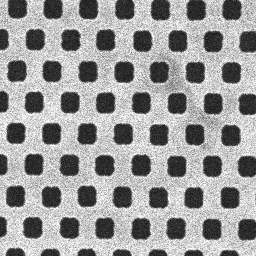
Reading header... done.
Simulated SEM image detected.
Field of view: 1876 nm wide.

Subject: a regular array of holes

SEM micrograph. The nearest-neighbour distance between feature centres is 0.26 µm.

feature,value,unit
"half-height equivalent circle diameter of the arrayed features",0.157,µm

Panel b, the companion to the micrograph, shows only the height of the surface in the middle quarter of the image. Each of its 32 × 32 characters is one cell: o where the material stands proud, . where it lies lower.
oooo....ooooo....ooooo....ooooo.
oooo....ooooo.....ooo.....ooooo.
oooo....ooooo.....ooo.....ooooo.
oooo....ooooo.....oooo....ooooo.
ooooo..oooooo....ooooo...oooooo.
oooooooooooooooooooooooooooooooo
oooooooooooooooooooooooooooooooo
...oooooo...ooooo....oooooo...oo
....oooo.....oooo.....oooo.....o
....oooo.....oooo.....oooo.....o
....oooo.....oooo.....oooo.....o
....oooo.....oooo.....oooo....oo
ooooooooooooooooooo.ooooooo..ooo
oooooooooooooooooooooooooooooooo
oooooooooooooooooooooooooooooooo
oooo....ooooo....ooooo....ooooo.
ooo.....oooo.....oooo.....oooo..
ooo.....oooo.....oooo.....oooo..
ooo.....oooo.....oooo.....oooo..
oooo....ooooo....oooo.....ooooo.
oooooooooooooooooooooooooooooooo
oooooooooooooooooooooooooooooooo
oooooooooooooooooooooooooooooooo
....oooo....ooooo....ooooo....oo
....oooo.....oooo.....oooo.....o
....oooo.....oooo.....oooo.....o
....oooo.....oooo.....oooo.....o
...ooooo....ooooo....ooooo....oo
oooooooooooooooooooooooooooooooo
oooooooooooooooooooooooooooooooo
ooooo..ooooooooooooooooooooooooo
ooo.....oooo.....ooooo....oooo..